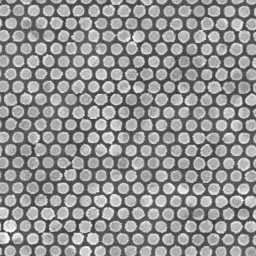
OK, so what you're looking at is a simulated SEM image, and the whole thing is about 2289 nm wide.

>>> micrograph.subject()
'a regular array of raised bodies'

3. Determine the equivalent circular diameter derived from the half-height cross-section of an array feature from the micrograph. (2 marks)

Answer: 99.8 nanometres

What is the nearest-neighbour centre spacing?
0.128 um